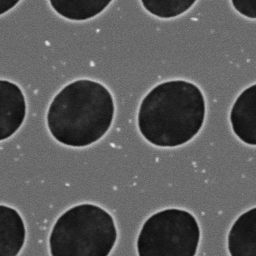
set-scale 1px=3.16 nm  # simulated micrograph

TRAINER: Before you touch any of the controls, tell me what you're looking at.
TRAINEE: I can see holes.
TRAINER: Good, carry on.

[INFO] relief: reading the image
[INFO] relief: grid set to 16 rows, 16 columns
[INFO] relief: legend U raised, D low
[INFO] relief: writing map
DUUDDDDUUDDDUUUD
UUUUUUUUUUUUUUUU
UUUUUUUUUUUUUUUU
UUUUUUUUUUUUUUUU
UUUUUUUUUUUUUUUU
DUUUDDDUUUDDUUUU
DDUDDDDUUDDDDUUD
DUUDDDDUUDDDDUDD
DUUDDDUUUDDDUUUD
UUUUUUUUUUUUUUUU
UUUUUUUUUUUUUUUU
UUUUUUUUUUUUUUUU
UUUUUUUUUUUUUUUU
DUUUDDDUUUDDUUUD
DDUDDDDUUDDDUUDD
DUUDDDDUUDDDUUDD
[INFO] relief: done